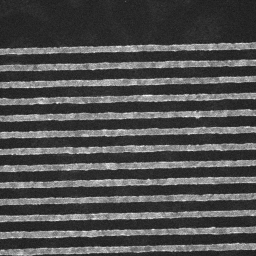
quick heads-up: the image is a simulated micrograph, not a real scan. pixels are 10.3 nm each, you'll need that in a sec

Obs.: parallel lines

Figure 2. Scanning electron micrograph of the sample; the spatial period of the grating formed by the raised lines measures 173 nm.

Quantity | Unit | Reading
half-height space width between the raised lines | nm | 116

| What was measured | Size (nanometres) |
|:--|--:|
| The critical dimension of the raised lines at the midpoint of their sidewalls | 58.1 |